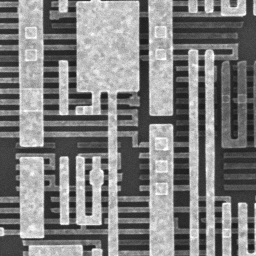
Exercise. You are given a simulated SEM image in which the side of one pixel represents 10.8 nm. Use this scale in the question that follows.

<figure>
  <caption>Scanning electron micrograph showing wiring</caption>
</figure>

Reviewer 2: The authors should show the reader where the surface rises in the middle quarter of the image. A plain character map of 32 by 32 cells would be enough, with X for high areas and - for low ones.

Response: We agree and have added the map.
X--XXXXXXXXXXXXXXXX--XXXXXX----X
X--XXXXXXXXXXXXXXXX--XXXXXX----X
X--XXXXXXXXXXXXXXXX--XXXXXX----X
X--XXXXXXXXXXXXXXXX--XXXXXX----X
X--XXXXXXXXXXXXXXXX--XXXXXX----X
X--XXXXXXXXXXXXXXXX--XXXXXX----X
X--XXXXXXXXXXXXXXXX--XXXXXX----X
X------XX--XX--------XXXXXX----X
X------XX--XX---------XXXXX----X
X------XX--XX---------XXXXX----X
X-----XXX--XX---------XXXXX----X
X--XXXXXX--XX---------XXXXX----X
X--XXXXXX--XX---------XXXXX----X
-----------XX------------------X
-----------XX------------------X
-----------XX---------XXXXX----X
-----------XX---------XXXXX----X
-----------XX---------XXXXX----X
-----------XX---------XXXXX----X
-----------XX---------XXXXX----X
-----------XX---------XXXXX----X
-----------XX---------XXXXX----X
-----------XX---------XXXXX----X
X--XX--XX--XX---------XXXXX----X
X--XX--XX--XX---------XXXXX----X
X--XX--XX--XX---------XXXXX----X
X--XX--XX--XX---------XXXXX----X
X--XX--XXX-XX---------XXXXX-----
X--XX--XXX-XX---------XXXXX-----
X--XX--XXX-XX---------XXXXX-----
X--XX--XX--XX---------XXXXX-----
X--XX--XX--XX---------XXXXX-----